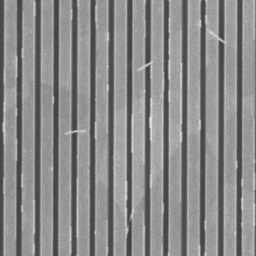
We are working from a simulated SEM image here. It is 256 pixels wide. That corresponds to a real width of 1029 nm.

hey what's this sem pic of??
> parallel lines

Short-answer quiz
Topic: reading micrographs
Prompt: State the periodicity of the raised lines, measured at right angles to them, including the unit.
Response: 73.7 nm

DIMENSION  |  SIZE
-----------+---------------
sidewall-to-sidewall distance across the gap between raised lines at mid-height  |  20.6 nm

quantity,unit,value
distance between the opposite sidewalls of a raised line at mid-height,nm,51.7